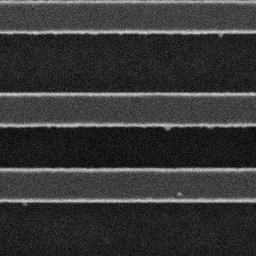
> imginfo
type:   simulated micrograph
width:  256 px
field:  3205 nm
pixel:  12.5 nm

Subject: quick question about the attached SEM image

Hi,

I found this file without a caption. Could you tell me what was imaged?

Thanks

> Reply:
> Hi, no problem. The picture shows lines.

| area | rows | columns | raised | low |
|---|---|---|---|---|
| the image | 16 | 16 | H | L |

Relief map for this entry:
HHHHHHHHHHHHHHHH
HHHHHHHHHHHHHHHH
LLLLLLLLLLLLLLLL
LLLLLLLLLLLLLLLL
LLLLLLLLLLLLLLLL
LLLLLLLLLLLLLLLL
HHHHHHHHHHHHHHHH
HHHHHHHHHHHHHHHH
LLLLLLLLLLLLLLLL
LLLLLLLLLLLLLLLL
LLLLLLLLLLLLLLLL
HHHHHHHHHHHHHHHH
HHHHHHHHHHHHHHHH
LLLLLLLLLLLLLLLL
LLLLLLLLLLLLLLLL
LLLLLLLLLLLLLLLL